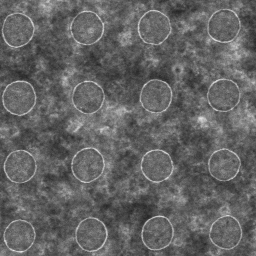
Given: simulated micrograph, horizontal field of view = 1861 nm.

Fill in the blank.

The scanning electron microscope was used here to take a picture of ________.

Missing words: a regular array of raised bodies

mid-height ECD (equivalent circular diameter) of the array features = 238 nm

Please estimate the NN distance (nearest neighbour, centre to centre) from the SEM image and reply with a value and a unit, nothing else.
492 nm